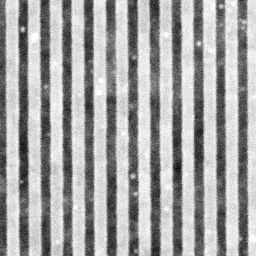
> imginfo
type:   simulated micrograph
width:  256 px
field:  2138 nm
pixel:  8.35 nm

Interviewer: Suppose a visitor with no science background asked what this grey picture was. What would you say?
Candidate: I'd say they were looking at parallel lines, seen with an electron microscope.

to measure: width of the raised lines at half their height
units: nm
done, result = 90.8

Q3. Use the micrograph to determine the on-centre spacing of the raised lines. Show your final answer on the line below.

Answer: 0.183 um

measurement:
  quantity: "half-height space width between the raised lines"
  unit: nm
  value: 95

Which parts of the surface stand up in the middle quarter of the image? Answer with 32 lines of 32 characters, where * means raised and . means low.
..***...**...***...**...***...**
..***..***...***...**...***...**
..***...**...***...**...***...**
..***...**...***...**...***...**
..***...**...***...**...***...**
..***...**...***...**...***...**
..***...**...***...**...***...**
..***...**...***...**...***...**
..***...**...***...**...***...**
..***...**...***...**...***...**
..***...**...***...**...***...**
..***...**...***...**...***...**
..***...**...***...**...***...**
..***...**...***...**...***...**
..***...**...***...**...***...**
..***...**...***...**...***...**
..***...**...***...**...***...**
..***...**...***...**...***...**
..***...**...***...**...***...**
..***...**...***...**...***...**
..***...**...***...**...***...**
..***...**...***...**...***...**
..***...**...***...**...***...**
..***...**...***...**...***...**
..***...**...***...**...***...**
..***...**...***...**...***...**
..***...**...***...***..***...**
..***...**...***...***..***...**
..***...**...***...***..***...**
..***...**...***...***..***...**
..***...**...***...**...***...**
..***...**...***...**...***...**